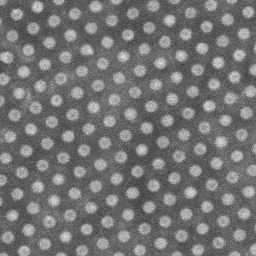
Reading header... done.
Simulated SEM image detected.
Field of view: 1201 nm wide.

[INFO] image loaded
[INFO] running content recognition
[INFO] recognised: a regular array of raised bodies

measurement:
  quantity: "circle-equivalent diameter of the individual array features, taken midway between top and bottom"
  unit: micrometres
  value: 0.0485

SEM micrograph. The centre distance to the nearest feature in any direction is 101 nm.